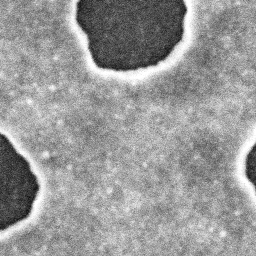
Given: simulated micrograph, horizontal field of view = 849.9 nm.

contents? holes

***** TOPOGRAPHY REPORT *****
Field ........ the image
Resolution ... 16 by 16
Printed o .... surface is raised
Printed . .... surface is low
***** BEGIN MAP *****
ooooo.......oooo
ooooo.......oooo
ooooo......ooooo
oooooo.....ooooo
ooooooo..ooooooo
oooooooooooooooo
oooooooooooooooo
oooooooooooooooo
oooooooooooooooo
.oooooooooooooo.
..ooooooooooooo.
..oooooooooooooo
..oooooooooooooo
..oooooooooooooo
oooooooooooooooo
oooooooooooooooo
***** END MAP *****